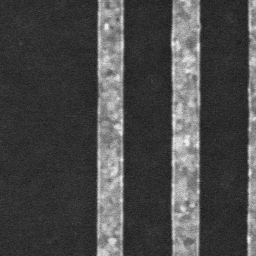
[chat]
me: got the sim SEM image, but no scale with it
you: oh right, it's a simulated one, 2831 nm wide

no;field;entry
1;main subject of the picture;one or a few lines or trenches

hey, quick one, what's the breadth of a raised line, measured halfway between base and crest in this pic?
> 0.264 um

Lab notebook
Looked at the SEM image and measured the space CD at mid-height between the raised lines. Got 0.568 µm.